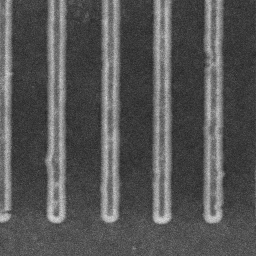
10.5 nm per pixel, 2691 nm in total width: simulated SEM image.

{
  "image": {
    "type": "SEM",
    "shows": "parallel lines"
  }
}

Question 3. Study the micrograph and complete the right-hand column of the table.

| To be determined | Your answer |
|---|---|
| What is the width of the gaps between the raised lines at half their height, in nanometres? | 407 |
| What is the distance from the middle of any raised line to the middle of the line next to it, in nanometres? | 550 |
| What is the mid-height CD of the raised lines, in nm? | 148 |